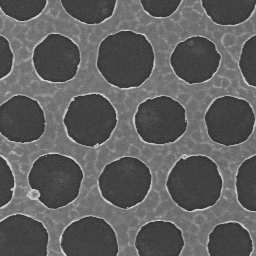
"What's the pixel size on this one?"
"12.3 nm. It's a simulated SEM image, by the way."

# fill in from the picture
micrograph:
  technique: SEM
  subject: a regular array of holes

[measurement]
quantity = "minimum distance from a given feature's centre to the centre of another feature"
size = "850 nm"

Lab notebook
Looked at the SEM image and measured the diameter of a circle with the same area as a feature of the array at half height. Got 634 nm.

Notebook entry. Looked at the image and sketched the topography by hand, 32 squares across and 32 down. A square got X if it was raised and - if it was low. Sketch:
------XX------XXXX----XXX-------
-----XXX------XXXX----XXXX------
XX--XXXXXX---XXXXXXXXXXXXX-----X
XXXXXXXXXXXXXXXXXXXXXXXXXXXXXXXX
XXXXXX--XXXXXX----XXXXXXXXXXXXXX
-XXXX----XXXX------XXX-----XXXX-
-XXX------XX-------XXX-----XXX--
--XX------XX-------XX------XXX--
-XXX------XX-------XXX-----XXX--
-XXXX----XXXX------XXX----XXXX--
XXXXXXXXXXXXXX----XXXXXXXXXXXXX-
XXXXXXXXXXXXXXXXXXXXXXXXXXXXXXXX
X---XXXXX----XXXXX----XXXXX---XX
-----XXX------XXX------XXX-----X
------XX-------XX------XXX------
------XX-------XX------XXX------
-----XXX------XXX------XXX------
X----XXXX----XXXXX----XXXXX----X
XXXXXXXXXXXXXXXXXXXXXXXXXXXXXXXX
XXXXX---XXXXXXXXXXXXXXXX--XXXXXX
-XXX------XXXX----XXXX-----XXX--
--XX------XXX------XX------XXX--
--XX------XX-------XX-------XX--
--XX------XX-------XX-------X---
--XXX-----XXX-----XXX-------XX--
-XXXX----XXXXX---XXXXX-----XXX--
XXXXXXXXXXXXXXXXXXXXXXXXXXXXXXXX
----XXXXXX---XXXXXXXXXXXXXXXXXXX
------XX------XXXX----XXXXX----X
------XX-------XX------XXX-----X
------XX-------XX------XXX------
------XX-------XX------XXX-----X